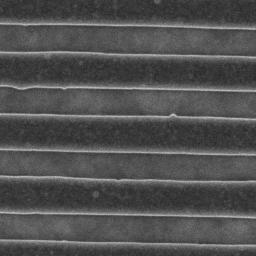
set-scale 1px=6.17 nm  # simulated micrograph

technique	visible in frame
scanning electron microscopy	one or a few lines or trenches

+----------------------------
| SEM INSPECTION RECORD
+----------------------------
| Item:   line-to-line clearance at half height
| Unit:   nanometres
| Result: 170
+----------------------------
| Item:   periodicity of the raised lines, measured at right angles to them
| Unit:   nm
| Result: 388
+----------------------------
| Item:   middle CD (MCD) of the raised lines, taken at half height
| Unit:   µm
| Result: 0.224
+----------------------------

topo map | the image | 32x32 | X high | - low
XXXXXXXXXXXXXXXXXXXXXXXXXXXXXXXX
XXXXXXXXXXXXXXXXXXXXXXXXXXXXXXXX
XXXXXXXXXXXXXXXXXXXXXXXXXXXXXXXX
----------------------------XXXX
--------------------------------
--------------------------------
--------------------------------
XXXXXXXXXXXXXXXXXXXXXXXXXXXXXXXX
XXXXXXXXXXXXXXXXXXXXXXXXXXXXXXXX
XXXXXXXXXXXXXXXXXXXXXXXXXXXXXXXX
XXXXXXXXXXXXXXXXXXXXXXXXXXXXXXXX
--------------------------------
--------------------------------
--------------------------------
XXXXXXXXXXXX----X----X----------
XXXXXXXXXXXXXXXXXXXXXXXXXXXXXXXX
XXXXXXXXXXXXXXXXXXXXXXXXXXXXXXXX
XXXXXXXXXXXXXXXXXXXXXXXXXXXXXXXX
XXXXXXXXXXXXXXXXXXXXXXXXXXXXXXXX
--------------------------------
--------------------------------
--------------------------------
XXXXXXXXXXXXXXXXX---------------
XXXXXXXXXXXXXXXXXXXXXXXXXXXXXXXX
XXXXXXXXXXXXXXXXXXXXXXXXXXXXXXXX
XXXXXXXXXXXXXXXXXXXXXXXXXXXXXXXX
XXXXXXXXXXXXXXXXXXXXXXXXXXXXXXXX
--------------------------------
--------------------------------
--------------------------------
XXXXXXXXXXXXXXXXXXXXXXX---------
XXXXXXXXXXXXXXXXXXXXXXXXXXXXXXXX